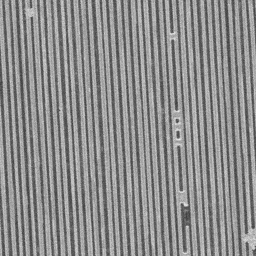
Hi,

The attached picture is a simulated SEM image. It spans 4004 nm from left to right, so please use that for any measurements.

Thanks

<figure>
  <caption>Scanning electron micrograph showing parallel lines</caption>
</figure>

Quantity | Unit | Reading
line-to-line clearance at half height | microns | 0.0566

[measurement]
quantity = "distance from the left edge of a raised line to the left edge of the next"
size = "0.109 microns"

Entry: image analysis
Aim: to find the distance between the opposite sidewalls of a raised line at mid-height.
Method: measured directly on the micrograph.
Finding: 54.6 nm